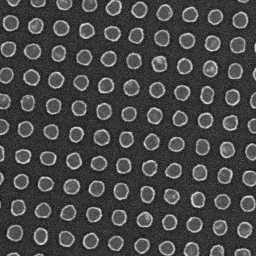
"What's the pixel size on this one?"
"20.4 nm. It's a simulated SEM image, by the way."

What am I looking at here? a regular array of raised bodies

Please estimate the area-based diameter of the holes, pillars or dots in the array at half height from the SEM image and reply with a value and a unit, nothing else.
0.301 µm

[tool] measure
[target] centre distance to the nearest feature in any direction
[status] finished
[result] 25 pixels